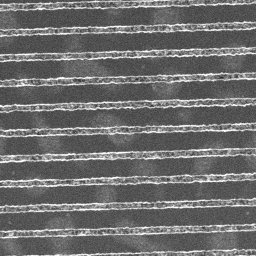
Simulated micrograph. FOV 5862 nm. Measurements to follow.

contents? parallel lines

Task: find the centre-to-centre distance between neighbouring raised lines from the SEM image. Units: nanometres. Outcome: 577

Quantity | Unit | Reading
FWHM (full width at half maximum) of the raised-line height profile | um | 0.14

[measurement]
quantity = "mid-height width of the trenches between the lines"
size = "438 nm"